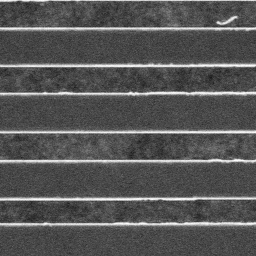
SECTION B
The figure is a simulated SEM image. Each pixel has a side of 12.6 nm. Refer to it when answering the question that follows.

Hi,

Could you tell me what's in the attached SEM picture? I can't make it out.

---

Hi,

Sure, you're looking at lines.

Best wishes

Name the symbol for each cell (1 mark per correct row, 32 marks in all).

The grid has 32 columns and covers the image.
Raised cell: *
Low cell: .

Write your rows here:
................................
................................
................................
................................
********************************
********************************
********************************
********************************
................................
................................
................................
................................
********************************
********************************
********************************
********************************
********************************
................................
................................
................................
********************************
********************************
********************************
********************************
********************************
................................
................................
................................
********************************
********************************
********************************
********************************